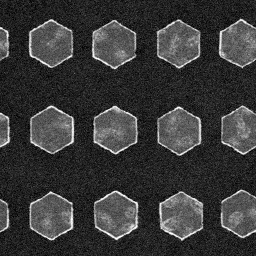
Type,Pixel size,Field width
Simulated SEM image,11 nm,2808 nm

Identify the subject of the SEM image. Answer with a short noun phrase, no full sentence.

a regular array of raised bodies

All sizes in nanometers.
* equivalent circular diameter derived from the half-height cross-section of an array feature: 484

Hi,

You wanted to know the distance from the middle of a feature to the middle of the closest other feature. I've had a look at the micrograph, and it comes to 699 nanometers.